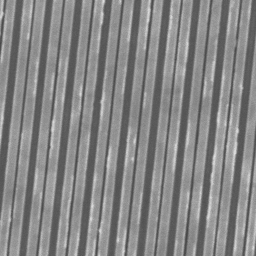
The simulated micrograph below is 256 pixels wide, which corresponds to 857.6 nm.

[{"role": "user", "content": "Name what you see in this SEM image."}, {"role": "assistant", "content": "parallel lines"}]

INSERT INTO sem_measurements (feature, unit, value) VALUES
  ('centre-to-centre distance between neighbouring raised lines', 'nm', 49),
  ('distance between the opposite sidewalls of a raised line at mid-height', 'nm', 30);